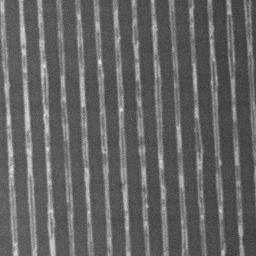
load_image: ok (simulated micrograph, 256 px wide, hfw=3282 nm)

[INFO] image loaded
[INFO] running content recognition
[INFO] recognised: parallel lines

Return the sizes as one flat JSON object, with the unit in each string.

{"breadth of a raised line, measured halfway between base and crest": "44.8 nanometers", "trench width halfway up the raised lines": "194 nm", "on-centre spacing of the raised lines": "242 nanometres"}